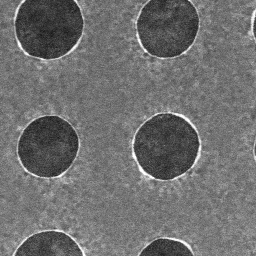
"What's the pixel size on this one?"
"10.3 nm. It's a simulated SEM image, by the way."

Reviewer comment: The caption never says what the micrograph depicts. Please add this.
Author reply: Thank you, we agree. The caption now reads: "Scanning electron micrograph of holes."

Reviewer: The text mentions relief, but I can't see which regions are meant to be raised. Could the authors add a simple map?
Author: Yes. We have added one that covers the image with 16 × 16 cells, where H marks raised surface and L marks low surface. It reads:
HLLLLHHHHLLLHHHH
HLLLLHHHHLLLHHHH
HLLLLHHHHLLLHHHH
HHLLHHHHHHLHHHHH
HHHHHHHHHHHHHHHH
HHHHHHHHHHHHHHHH
HHHHHHHHHHHHHHHH
HHLLHHHHHLLLHHHH
HLLLLHHHLLLLHHHH
HLLLLHHHLLLLHHHH
HHLLHHHHHLLLHHHH
HHHHHHHHHHHHHHHH
HHHHHHHHHHHHHHHH
HHHHHHHHHHHHHHHH
HHHLHHHHHHHHHHHH
HLLLLHHHHLLLHHHH